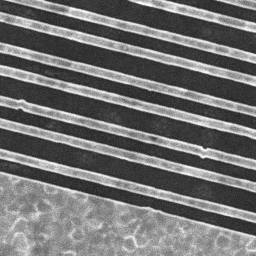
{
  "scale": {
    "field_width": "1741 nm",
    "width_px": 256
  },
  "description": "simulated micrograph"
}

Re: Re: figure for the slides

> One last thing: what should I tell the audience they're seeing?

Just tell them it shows parallel lines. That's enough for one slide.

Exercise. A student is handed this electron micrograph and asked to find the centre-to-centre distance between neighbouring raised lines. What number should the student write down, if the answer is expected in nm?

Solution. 178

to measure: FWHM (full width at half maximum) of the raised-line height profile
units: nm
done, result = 57.7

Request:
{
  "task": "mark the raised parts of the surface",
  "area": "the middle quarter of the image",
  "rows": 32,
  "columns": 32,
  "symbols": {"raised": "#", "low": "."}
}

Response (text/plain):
#######......................###
...########.....................
.......########.................
...........#######..............
..............#########.........
####..............########......
########.............##########.
...#########..............######
.......#########..............##
...........#########............
...............#########........
...................#########....
##.....................#########
######.....................#####
.#########......................
.....#########..................
.........########...............
.............########...........
###..............########.......
########............#########...
..#########..............#######
......#########..............###
..........#########.............
..............#########.........
..................########......
......................########..
#####.....................######
#########.....................##
....#########...................
........#########...............
............########............
#...............#######.........